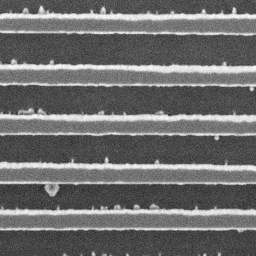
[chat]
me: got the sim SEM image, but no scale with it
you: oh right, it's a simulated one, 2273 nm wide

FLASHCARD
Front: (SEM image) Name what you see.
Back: lines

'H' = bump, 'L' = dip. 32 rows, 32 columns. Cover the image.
LLLLLLLLLLLLLLLLLLLLLLLLLLLLLLLL
LLLLLLLLLLLLLLLLLLLLLLLLLLLLLLLL
HHHHHHHHHHHHHHHHHHHHHHHHHHHHHHHH
HHHHHHHHHHHHHHHHHHHHHHHHHHHHHHHH
LLLLLLLLLLLLLLLLLLLLLLLLLLLLLLLL
LLLLLLLLLLLLLLLLLLLLLLLLLLLLLLLL
LLLLLLLLLLLLLLLLLLLLLLLLLLLLLLLL
LLLLLLLLLLLLLLLLLLLLLLLLLLLLLLLL
HHHHHHHHHHHHHHHHHHHHLHHLLLHLLLLH
HHHHHHHHHHHHHHHHHHHHHHHHHHHHHHHH
HHHHHHHHHHHHHHHHHHHHHHHHHHHHHHHH
LLLLLLLLLLLLLLLLLLLLLLLLLLLLLLLL
LLLLLLLLLLLLLLLLLLLLLLLLLLLLLLLL
LLLLLLLLLLLLLLLLLLLLLLLLLLLLLLLL
HHLLHHLLLLLLLLLLLLLLLLLLLLLLLLLL
HHHHHHHHHHHHHHHHHHHHHHHHHHHHHHHH
HHHHHHHHHHHHHHHHHHHHHHHHHHHHHHHH
LLLLLLLLLLLLLLLLLLLLLLLLLLLLLLLL
LLLLLLLLLLLLLLLLLLLLLLLLLLLLLLLL
LLLLLLLLLLLLLLLLLLLLLLLLLLLLLLLL
LLLLLLLLLLLLLLLLLLLLLLLLLLLLLLLL
HHHHHHHHHHHHHHHHHHHHHHHHHHHHHHHH
HHHHHHHHHHHHHHHHHHHHHHHHHHHHHHHH
LLLLLLLLLLLLLLLLLLLLLLLLLLLLLLLL
LLLLLLLLLLLLLLLLLLLLLLLLLLLLLLLL
LLLLLLLLLLLLLLLLLLLLLLLLLLLLLLLL
HHHHHHHHHHHHHHHHHHHHHHHHHLHHHHHH
HHHHHHHHHHHHHHHHHHHHHHHHHHHHHHHH
HHHHHHHHHHHHHHHHHHHHHHHHHHHHHHHH
LLLLLLLLLLLLLLLLLLLLLLLLLLLLLLLL
LLLLLLLLLLLLLLLLLLLLLLLLLLLLLLLL
LLLLLLLLLLLLLLLLLLLLLLLLLLLLLLLL